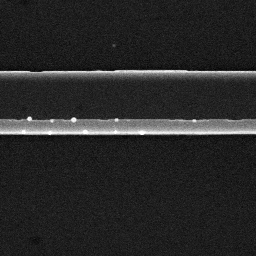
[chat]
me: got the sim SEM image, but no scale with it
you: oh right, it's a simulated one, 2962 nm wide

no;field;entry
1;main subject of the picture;lines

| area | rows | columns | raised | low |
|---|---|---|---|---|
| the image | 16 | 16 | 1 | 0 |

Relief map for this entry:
0000000000000000
0000000000000000
0000000000000000
0000000000000000
0100011111111110
1111111111111111
1111111111111111
1111111111111111
0000000000000000
0000000000000000
0000000000000000
0000000000000000
0000000000000000
0000000000000000
0000000000000000
0000000000000000